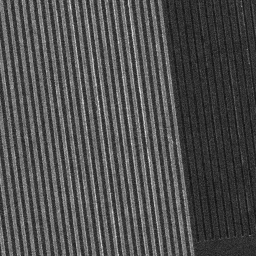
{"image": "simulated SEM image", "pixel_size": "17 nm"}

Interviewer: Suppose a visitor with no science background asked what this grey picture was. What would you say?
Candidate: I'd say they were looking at parallel lines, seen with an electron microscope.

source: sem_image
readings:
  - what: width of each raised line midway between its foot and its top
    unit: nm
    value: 50.7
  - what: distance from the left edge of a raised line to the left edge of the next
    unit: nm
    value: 128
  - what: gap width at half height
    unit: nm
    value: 73.9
